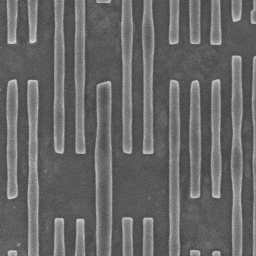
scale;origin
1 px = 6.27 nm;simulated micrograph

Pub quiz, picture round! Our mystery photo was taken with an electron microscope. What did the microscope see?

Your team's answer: wiring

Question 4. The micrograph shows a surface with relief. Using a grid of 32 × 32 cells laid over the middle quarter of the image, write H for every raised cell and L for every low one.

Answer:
LLLHHLLLLLLLLLLHHLLLHHLLLLLLLLLL
LLLHHLLLLLLLLLLHHLLLHHLLLLLLLLLL
LLLHHLLLLLLLLLLHHLLLHHLLLLLLLLLL
LLLHHLLLLLLLLLLHHLLLHHLLLLLLLLLL
LLLHHLLLLLHLLLLHHLLLHHLLLLLHLLLL
LLLHHLLLHHHHLLLHHLLLHHLLLLLHHLLL
LLLHHLLLHHHHLLLHHLLLHHLLLLLHHLLL
LLLHHLLLHHHHLLLHHLLLHHLLLLHHHLLL
LLLHHLLLHHHHLLLHHLLLHHLLLLHHHLLL
LLLHHLLLHHHHLLLHHLLLHHLLLLHHHLLL
LLLHHLLLHHHHLLLHHLLLHHLLLLHHHLLL
LLLHHLLLHHHHLLLHHLLLHHLLLLHHHLLL
LLLHHLLLHHHHLLLHHLLLHHLLLLHHHLLL
LLLHHLLLHHHHLLLHHLLLHHLLLLHHHLLL
LLLHHLLLLHHHLLLHHLLLHHLLLLHHHLLH
LLLHHLLLLHHHLLLHHLLLHHLLLLHHHLLH
LLLHHLLLHHHHLLLHHLLLHHLLLLHHHLLH
LLLHHLLLHHHHLLLHHLLLHHLLLLHHHLLH
LLLHHLLLHHHHLLLHHLLLHHLLLLHHHLLH
LLLHHLLLHHHHLLLHHLLLHHLLLLHHHLLH
LLLHHLLLHHHHLLLHHLLLHHLLLLHHHLLH
LLLHHLLLHHHHLLLHHLLLHHLLLLHHHLLH
LLLLLLLLHHHHLLLLLLLLLLLLLLLHHLLL
LLLLLLLLHHHHLLLLLLLLLLLLLLHHHLLL
LLLLLLLLHHHHLLLLLLLLLLLLLLHHHLLL
LLLLLLLLHHHHLLLLLLLLLLLLLLHHHLLL
LLLLLLLLHHHHLLLLLLLLLLLLLLHHHLLL
LLLLLLLLHHHHLLLLLLLLLLLLLLHHHLLL
LLLLLLLLHHHHLLLLLLLLLLLLLLHHHLLL
LLLLLLLLHHHHLLLLLLLLLLLLLLHHHLLL
LLLLLLLLHHHHLLLLLLLLLLLLLLHHHLLL
LLLLLLLLHHHHLLLLLLLLLLLLLLHHHLLL